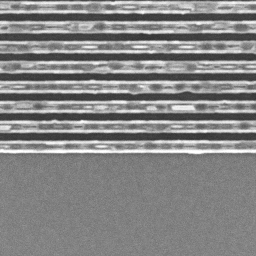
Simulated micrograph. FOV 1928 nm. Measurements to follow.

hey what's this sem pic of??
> parallel lines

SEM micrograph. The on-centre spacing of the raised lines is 150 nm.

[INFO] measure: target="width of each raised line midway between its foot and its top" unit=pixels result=11.5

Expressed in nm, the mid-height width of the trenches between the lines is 57.4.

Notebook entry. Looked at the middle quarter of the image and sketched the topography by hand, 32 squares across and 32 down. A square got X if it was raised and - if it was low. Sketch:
XXXXXXXXXXXXXXXXXXXXXXXXXXXXXXXX
XXXXXXXXXXXXXXXXXXXXXXXXXXXXXXXX
--------------------------------
--------------------------------
XXXXXXXXXXXXXXXX-----XXXXXX--XXX
XXXXXXXXXXXXXXXXXXXXXXXXXXXXXXXX
XXXXXXXXXXXXXXXXXXXXXXXXXXXXXXXX
--------------------------------
--------------------------------
XXX--------XXXXX-X-XX--XXXXXX---
XXXXXXXXXXXXXXXXXXXXXXXXXXXXXXXX
XXXXXXXXXXXXXXXXXXXXXXXXXXXXXXXX
--------------------------------
--------------------------------
XXX-XXXXX-XXXXXXXXXXXXXXXXXXXXXX
XXXXXXXXXXXXXXXXXXXXXXXXXXXXXXXX
XXXXXXXXXXXXXXXXXXXXXXXXXXXXXXXX
--------------------------------
--------------------------------
XXXXXXXXXXXXXXXXXXXXXXXXXXXXXXXX
XXXXXXXXXXXXXXXXXXXXXXXXXXXXXXXX
XXXXXXXXXXXXXXXXXXXXXXXXXXXXXXXX
--------------------------------
--------------------------------
--------------------------------
--------------------------------
--------------------------------
--------------------------------
--------------------------------
--------------------------------
--------------------------------
--------------------------------